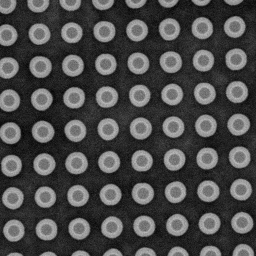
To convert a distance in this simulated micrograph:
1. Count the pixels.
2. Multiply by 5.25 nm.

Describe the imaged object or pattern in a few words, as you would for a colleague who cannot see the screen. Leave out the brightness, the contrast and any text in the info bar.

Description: an array of small figures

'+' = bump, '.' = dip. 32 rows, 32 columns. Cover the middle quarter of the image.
+++++...+++++...+++++...+++++...
+++++...+++++....++++....++++...
.+++.....++.....................
................................
................................
..................++......+++...
.+++.....++++....++++....++++...
+++++...+++++...++++++..++++++..
+++++...+++++...+++++...++++++..
+++++...+++++....++++....++++...
.+++.....+++......++............
................................
................................
...................+......+++...
.+++.....++++....++++....+++++..
+++++....+++++...+++++...+++++..
+++++....+++++...+++++...+++++..
+++++....++++....+++++...++++...
.++++....+++......+++...........
................................
................................
...........................++...
..+++.....+++....++++....+++++..
.++++....+++++...+++++...+++++..
++++++...+++++...+++++...+++++..
++++++...+++++...+++++...+++++..
.++++....++++.....+++......+....
................................
................................
............................+...
..++......+++.....++++....++++..
.+++++...+++++...+++++...+++++..